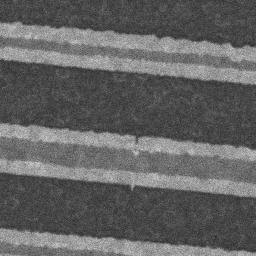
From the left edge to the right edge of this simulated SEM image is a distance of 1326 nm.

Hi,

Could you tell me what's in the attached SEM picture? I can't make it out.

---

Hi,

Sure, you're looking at one or a few lines or trenches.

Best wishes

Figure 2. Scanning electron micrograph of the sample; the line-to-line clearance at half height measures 375 nanometres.